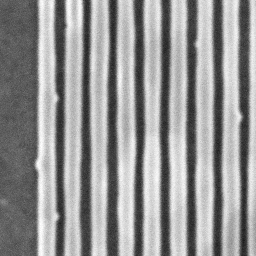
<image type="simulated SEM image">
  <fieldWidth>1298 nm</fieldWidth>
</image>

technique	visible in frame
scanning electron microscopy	parallel lines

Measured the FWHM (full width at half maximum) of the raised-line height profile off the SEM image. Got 74.7 nm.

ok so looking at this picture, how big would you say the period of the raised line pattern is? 133 nm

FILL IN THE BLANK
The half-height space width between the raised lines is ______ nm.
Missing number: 55.1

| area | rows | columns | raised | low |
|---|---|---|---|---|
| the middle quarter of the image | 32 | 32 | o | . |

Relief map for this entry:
.ooo...oooo...ooo...oooo...ooo..
.ooo...oooo...ooo...oooo...oooo.
.ooo...oooo...ooo...oooo...oooo.
.ooo...oooo...ooo...oooo...oooo.
.ooo...oooo...ooo...oooo...ooo..
.ooo...oooo...ooo...oooo...ooo..
.ooo...oooo...ooo...oooo...ooo..
.ooo...oooo...ooo...oooo...ooo..
.ooo...oooo...ooo...oooo...ooo..
.ooo...oooo...ooo...oooo...ooo..
oooo...oooo...ooo...oooo...ooo..
.ooo...ooo....ooo...oooo...ooo..
.ooo...ooo....ooo...oooo...ooo..
.ooo...ooo....ooo...oooo...ooo..
.ooo...ooo....ooo....ooo...ooo..
.ooo...oooo...ooo...oooo...ooo..
.ooo...oooo...ooo...oooo...ooo..
.ooo...oooo...ooo...oooo...ooo..
.ooo...oooo...ooo...oooo...ooo..
.ooo...oooo...ooo...oooo...ooo..
.ooo...oooo...ooo...oooo...ooo..
.ooo...ooo....ooo...oooo...ooo..
oooo...ooo....ooo...oooo...ooo..
oooo...ooo....ooo...oooo...ooo..
oooo...ooo....ooo...oooo...ooo..
oooo...ooo....ooo...oooo...ooo..
oooo...ooo....ooo...oooo...ooo..
oooo...ooo....ooo...oooo...ooo..
oooo...ooo....ooo...oooo...ooo..
oooo...ooo....ooo...oooo...ooo..
oooo...ooo....ooo...oooo...ooo..
oooo...ooo....ooo...oooo...ooo..